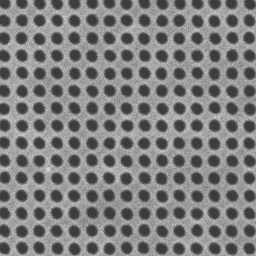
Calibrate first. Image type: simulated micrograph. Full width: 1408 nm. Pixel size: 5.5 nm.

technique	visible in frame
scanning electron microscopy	a regular array of holes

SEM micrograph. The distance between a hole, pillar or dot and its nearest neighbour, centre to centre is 93.6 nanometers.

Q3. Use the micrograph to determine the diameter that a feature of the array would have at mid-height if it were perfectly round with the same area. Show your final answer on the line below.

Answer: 12.3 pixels